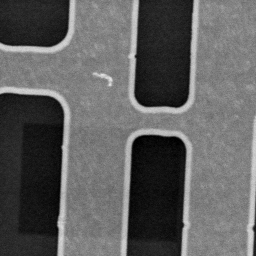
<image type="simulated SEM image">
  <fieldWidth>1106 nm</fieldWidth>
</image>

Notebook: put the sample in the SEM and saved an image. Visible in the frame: one or a few lines or trenches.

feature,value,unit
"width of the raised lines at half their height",64.9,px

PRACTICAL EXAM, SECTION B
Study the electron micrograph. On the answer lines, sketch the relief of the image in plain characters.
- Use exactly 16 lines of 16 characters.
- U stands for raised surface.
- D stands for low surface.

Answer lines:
DDDDDUUUDDDDUUUU
DDDDUUUUDDDDUUUU
DDDDUUUUDDDDUUUU
UUUUUUUUDDDDUUUU
UUUUUUUUDDDDUUUU
UUUUUUUUDDDDUUUU
DDDDUUUUUDDDUUUU
DDDDUUUUUUUUUUUU
DDDDUUUUDDDUUUUU
DDDDUUUUDDDDUUUU
DDDDUUUUDDDDUUUU
DDDDUUUUDDDDUUUU
DDDDUUUUDDDDUUUU
DDDDUUUUDDDDUUUU
DDDDUUUUDDDDUUUU
DDDDUUUUDDDDUUUU